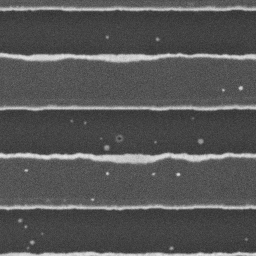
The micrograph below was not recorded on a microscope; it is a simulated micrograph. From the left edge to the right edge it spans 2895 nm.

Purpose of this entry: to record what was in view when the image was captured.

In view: lines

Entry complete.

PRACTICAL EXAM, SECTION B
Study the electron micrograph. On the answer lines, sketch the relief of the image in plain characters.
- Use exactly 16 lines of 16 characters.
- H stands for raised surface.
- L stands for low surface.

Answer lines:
HHHHHHHHHHHHHHHH
LLLLLLLLLLLLLLLL
LLLLLLLLLLLLLLLL
HLLLHLLLLLHHHHLL
HHHHHHHHHHHHHHHH
HHHHHHHHHHHHHHHH
HHHHHHHHHHHHHHHH
LLLLLLLLLLLLLLLL
LLLLLLLLLLLLLLLL
LLLLLLLLLLLLLLLL
HHHHHHHHHHHHHHHH
HHHHHHHHHHHHHHHH
HHHHHHHHHHHHHHHH
LLLLLLLLLLLLLLLL
LLLLLLLLLLLLLLLL
LLLLLLLLLLLLLLLL